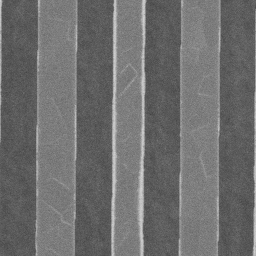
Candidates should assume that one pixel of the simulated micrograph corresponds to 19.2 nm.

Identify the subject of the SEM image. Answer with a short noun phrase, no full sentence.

lines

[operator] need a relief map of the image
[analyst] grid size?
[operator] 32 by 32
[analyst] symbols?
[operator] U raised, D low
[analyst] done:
DDDDDUUUUUDDDDUUUUDDDDDUUUUDDDDD
DDDDDUUUUUDDDDUUUUDDDDDUUUUDDDDD
DDDDDUUUUUDDDDUUUUDDDDDUUUUDDDDD
DDDDDUUUUUDDDDUUUUDDDDDUUUUDDDDD
DDDDDUUUUUDDDDUUUUDDDDDUUUUDDDDD
DDDDDUUUUUDDDDUUUUDDDDDUUUUDDDDD
DDDDDUUUUUDDDDUUUUDDDDDUUUUDDDDD
DDDDDUUUUDDDDDUUUUDDDDDUUUUDDDDD
DDDDDUUUUDDDDDUUUUDDDDDUUUUDDDDD
DDDDDUUUUDDDDDUUUUDDDDDUUUUDDDDD
DDDDDUUUUDDDDDUUUUDDDDDUUUUDDDDD
DDDDDUUUUDDDDDUUUUDDDDDUUUUDDDDD
DDDDDUUUUDDDDDUUUUDDDDDUUUUDDDDD
DDDDDUUUUDDDDDUUUUDDDDDUUUUDDDDD
DDDDDUUUUDDDDDUUUUDDDDDUUUUDDDDD
DDDDDUUUUDDDDDUUUUDDDDDUUUUDDDDD
DDDDDUUUUDDDDDUUUUDDDDDUUUUDDDDD
DDDDDUUUUDDDDDUUUUDDDDDUUUUDDDDD
DDDDDUUUUDDDDDUUUUDDDDDUUUUDDDDD
DDDDDUUUUDDDDDUUUUDDDDDUUUUDDDDD
DDDDDUUUUDDDDDUUUUDDDDDUUUUDDDDD
DDDDDUUUUDDDDDUUUUDDDDDUUUUDDDDD
DDDDDUUUUDDDDDUUUUDDDDDUUUUDDDDD
DDDDDUUUUDDDDDUUUUDDDDDUUUUDDDDD
DDDDDUUUUDDDDDUUUUDDDDDUUUUDDDDD
DDDDDUUUUDDDDDUUUUDDDDDUUUUDDDDD
DDDDDUUUUDDDDDUUUUDDDDDUUUUDDDDD
DDDDDUUUUDDDDDUUUUDDDDDUUUUDDDDD
DDDDDUUUUDDDDDUUUUDDDDDUUUUDDDDD
DDDDDUUUUDDDDDUUUUDDDDUUUUUDDDDD
DDDDDUUUUDDDDDUUUUDDDDUUUUUDDDDD
DDDDDUUUUDDDDDUUUUDDDDUUUUUDDDDD